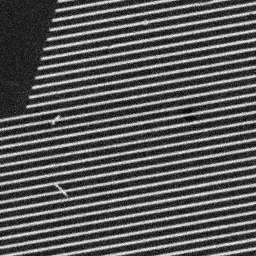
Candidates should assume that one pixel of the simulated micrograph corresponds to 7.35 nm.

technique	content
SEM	parallel lines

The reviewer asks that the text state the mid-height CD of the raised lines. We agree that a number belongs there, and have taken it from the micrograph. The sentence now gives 13.5 nanometers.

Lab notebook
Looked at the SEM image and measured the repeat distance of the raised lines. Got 8.94 pixels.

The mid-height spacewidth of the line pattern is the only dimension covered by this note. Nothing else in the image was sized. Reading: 52.5 nm